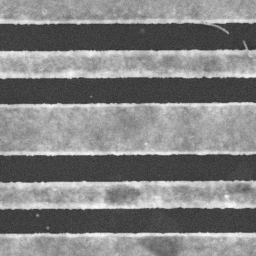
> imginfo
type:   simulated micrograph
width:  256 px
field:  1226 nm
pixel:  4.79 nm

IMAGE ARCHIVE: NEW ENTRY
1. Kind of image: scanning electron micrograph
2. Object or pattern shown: lines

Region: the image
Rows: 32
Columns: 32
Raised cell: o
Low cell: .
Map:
oooooooooooooooooooooooooooooooo
oooooooooooooooooooooooooooooooo
oooooooooooooooooooooooooooooooo
................................
................................
................................
........oooo.ooooooooooooooooooo
oooooooooooooooooooooooooooooooo
oooooooooooooooooooooooooooooooo
ooooooooo..oo.o...o....ooooooooo
................................
................................
................................
oooooooooooooooooooooooooooooooo
oooooooooooooooooooooooooooooooo
oooooooooooooooooooooooooooooooo
oooooooooooooooooooooooooooooooo
oooooooooooooooooooooooooooooooo
oooooooooooooooooooooooooooooooo
................................
................................
................................
................................
oooooooooooooooooooooooooooooooo
oooooooooooooooooooooooooooooooo
oooooooooooooooooooooooooooooooo
................................
................................
................................
oooooooooooooooooooooooooooooooo
oooooooooooooooooooooooooooooooo
oooooooooooooooooooooooooooooooo